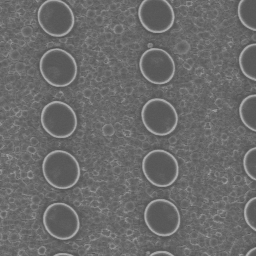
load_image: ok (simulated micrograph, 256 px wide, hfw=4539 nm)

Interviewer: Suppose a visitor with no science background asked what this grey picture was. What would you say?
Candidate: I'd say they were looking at a regular array of raised bodies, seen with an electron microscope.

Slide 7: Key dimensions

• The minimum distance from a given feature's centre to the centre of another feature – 0.893 microns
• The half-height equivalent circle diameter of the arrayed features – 621 nm